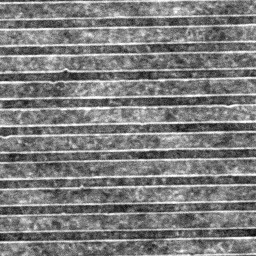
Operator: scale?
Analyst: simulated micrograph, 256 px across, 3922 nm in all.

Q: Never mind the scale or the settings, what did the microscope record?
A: parallel lines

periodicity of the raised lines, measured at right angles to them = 0.407 microns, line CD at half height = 253 nm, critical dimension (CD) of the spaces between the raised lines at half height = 147 nanometers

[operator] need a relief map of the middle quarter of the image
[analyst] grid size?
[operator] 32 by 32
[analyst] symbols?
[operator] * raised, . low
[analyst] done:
********************************
.*************..................
................................
................................
.....***************************
********************************
********************************
********************************
................................
................................
................................
********************************
********************************
********************************
********************************
................................
................................
..................********....**
********************************
********************************
********************************
***************.................
................................
................................
...*****************************
********************************
********************************
********************************
................................
................................
...............................*
********************************